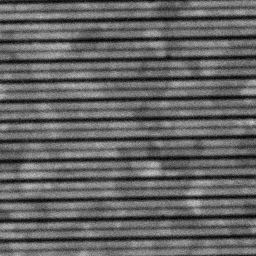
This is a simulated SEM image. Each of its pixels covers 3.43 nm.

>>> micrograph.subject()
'parallel lines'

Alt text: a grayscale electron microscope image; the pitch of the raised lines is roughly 34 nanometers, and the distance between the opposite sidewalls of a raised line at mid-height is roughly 21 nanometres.